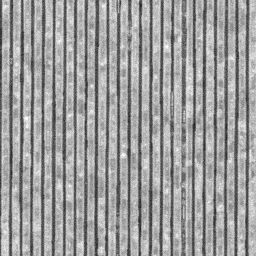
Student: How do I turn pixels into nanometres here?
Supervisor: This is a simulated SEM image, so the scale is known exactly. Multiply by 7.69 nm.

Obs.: parallel lines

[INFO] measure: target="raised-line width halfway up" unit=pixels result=7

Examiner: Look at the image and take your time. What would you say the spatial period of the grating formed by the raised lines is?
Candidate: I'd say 82.7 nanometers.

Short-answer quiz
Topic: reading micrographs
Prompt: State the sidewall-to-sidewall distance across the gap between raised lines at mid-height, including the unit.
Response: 0.0308 um